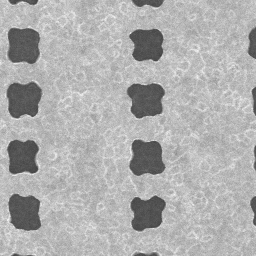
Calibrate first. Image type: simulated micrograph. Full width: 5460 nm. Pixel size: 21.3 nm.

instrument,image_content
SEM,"a regular array of holes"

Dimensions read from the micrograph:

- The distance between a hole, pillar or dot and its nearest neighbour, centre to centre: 1170 nm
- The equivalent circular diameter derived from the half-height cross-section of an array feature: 765 nanometres